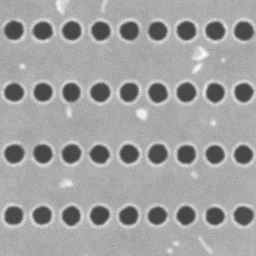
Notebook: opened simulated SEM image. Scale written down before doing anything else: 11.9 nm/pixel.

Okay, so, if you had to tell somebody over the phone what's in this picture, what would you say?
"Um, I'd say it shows a regular array of holes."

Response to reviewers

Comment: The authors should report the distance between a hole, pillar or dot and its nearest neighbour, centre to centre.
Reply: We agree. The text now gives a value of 0.34 micrometres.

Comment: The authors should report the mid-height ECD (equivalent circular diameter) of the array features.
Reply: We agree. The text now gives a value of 249 nm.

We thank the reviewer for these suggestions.